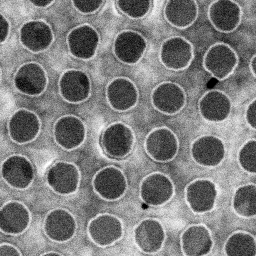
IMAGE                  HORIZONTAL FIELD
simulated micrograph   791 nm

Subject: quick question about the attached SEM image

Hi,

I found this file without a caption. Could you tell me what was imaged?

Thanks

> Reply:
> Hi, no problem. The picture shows a regular array of raised bodies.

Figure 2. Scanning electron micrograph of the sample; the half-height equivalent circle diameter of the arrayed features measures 106 nm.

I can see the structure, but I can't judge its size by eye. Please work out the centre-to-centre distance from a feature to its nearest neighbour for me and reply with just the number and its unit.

139 nm